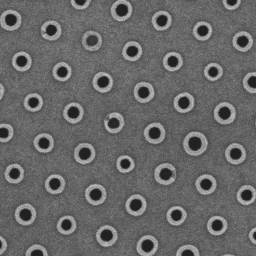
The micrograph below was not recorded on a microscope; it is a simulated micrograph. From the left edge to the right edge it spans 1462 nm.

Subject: a regular array of ring-shaped raised bodies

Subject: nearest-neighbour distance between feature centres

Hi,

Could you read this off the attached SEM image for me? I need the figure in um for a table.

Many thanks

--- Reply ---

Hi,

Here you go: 0.238